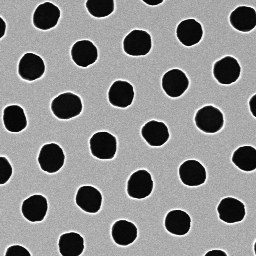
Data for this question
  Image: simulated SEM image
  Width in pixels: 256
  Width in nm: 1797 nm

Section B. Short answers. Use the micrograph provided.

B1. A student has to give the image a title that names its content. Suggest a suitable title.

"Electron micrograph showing a regular array of holes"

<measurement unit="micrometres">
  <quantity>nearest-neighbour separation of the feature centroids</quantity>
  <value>0.37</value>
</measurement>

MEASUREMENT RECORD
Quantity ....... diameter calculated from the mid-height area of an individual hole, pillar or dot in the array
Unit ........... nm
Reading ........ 186